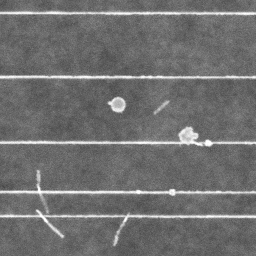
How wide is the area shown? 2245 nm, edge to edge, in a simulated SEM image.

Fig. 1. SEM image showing lines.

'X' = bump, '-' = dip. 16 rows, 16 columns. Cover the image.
XXXXXXXXXXXXXXXX
----------------
----------------
----------------
----------------
XXXXXXXXXXXXXXXX
XXXXXXXXXXXXXXXX
XXXXXXXXXXXXXXXX
XXXXXXXXXXXXXXXX
----------------
----------------
----------------
XXXXXXXXXXXXXXXX
XXXXXXXXXXXXXXXX
----------------
----------------